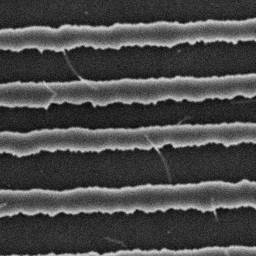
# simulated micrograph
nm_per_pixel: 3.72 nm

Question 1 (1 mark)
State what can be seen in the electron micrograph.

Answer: lines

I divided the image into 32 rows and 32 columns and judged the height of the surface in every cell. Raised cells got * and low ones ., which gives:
................................
................................
...............................*
...***.*************************
********************************
**********************..........
................................
................................
................................
.............................***
********************************
********************************
********************..*.*.......
................................
................................
............................****
*...****************************
********************************
********************............
..*.............................
................................
................................
................................
...........*....****************
********************************
********************************
**********.*.*.**...............
................................
................................
................................
................................
...............*****************